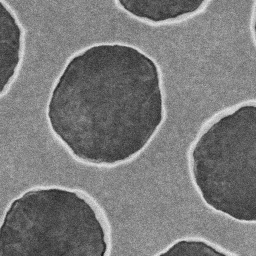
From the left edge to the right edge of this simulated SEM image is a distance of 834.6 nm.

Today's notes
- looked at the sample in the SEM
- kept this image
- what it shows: holes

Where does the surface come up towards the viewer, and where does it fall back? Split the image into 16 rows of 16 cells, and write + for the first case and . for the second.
++++++++....++++
.+++++++++++++++
.+++++++++++++++
.++++....+++++++
.+++......++++++
+++.......++++++
+++.......+++++.
+++.......+++...
++++.....++++...
+++++....+++....
++++++++++++....
++++++++++++....
+.....+++++++...
......++++++++..
.......+++++++++
.......++++..+++